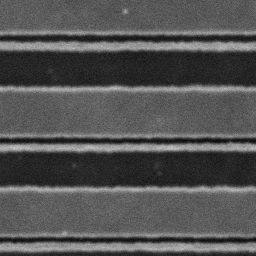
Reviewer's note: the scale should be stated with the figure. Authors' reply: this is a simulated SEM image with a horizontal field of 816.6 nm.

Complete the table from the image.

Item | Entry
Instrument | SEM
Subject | lines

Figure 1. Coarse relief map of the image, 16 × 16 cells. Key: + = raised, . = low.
++++++++++++++++
++++++++++++++++
++++++++++++++++
................
................
+....+++..+.+.+.
++++++++++++++++
++++++++++++++++
++++++++++++++++
................
................
................
++++++++++++++++
++++++++++++++++
++++++++++++++++
++++++++++++++++